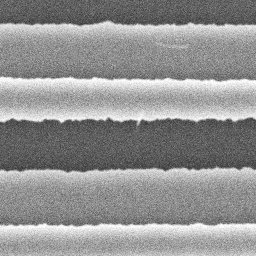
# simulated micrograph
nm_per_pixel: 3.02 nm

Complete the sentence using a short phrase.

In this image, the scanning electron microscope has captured lines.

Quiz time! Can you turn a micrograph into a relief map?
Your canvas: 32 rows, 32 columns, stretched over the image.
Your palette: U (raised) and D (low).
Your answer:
DDDDDDDDDDDDDDDDDDDDDDDDDDDDDDDD
DDDDDDDDDDDDDDDDDDDDDDDDDDDDDDDD
DDDDDDDDDDDDDDDDDDDDDDDDDDDDDDDD
UUUUUUUUUUUUUUUUUUUUUUUUUUUUUUUU
UUUUUUUUUUUUUUUUUUUUUUUUUUUUUUUU
UUUUUUUUUUUUUUUUUUUUUUUUUUUUUUUU
UUUUUUUUUUUUUUUUUUUUUUUUUUUUUUUU
UUUUUUUUUUUUUUUUUUUUUUUUUUUUUUUU
UUUUUUUUUUUUUUUUUUUUUUUUUUUUUUUU
UUUUUUUUUUUUUUUUUUUUUUUUUUUUUUUU
UUUUUUUUUUUUUUUUUUUUUUUUUUUUUUUU
UUUUUUUUUUUUUUUUUUUUUUUUUUUUUUUU
UUUUUUUUUUUUUUUUUUUUUUUUUUUUUUUU
UUUUUUUUUUUUUUUUUUUUUUUUUUUUUUUU
UUUUUUUUUUUUUUUUUUUUUUUUUUUUUUUU
DDDDDDDDDDDDDDDDDDDDDDDDDDDDDDDD
DDDDDDDDDDDDDDDDDDDDDDDDDDDDDDDD
DDDDDDDDDDDDDDDDDDDDDDDDDDDDDDDD
DDDDDDDDDDDDDDDDDDDDDDDDDDDDDDDD
DDDDDDDDDDDDDDDDDDDDDDDDDDDDDDDD
DDDDDDDDDDDDDDDDDDDDDDDDDDDDDDDD
UUUUUUUUDDDUUUUUUUUUUUUUUUUUUUUU
UUUUUUUUUUUUUUUUUUUUUUUUUUUUUUUU
UUUUUUUUUUUUUUUUUUUUUUUUUUUUUUUU
UUUUUUUUUUUUUUUUUUUUUUUUUUUUUUUU
UUUUUUUUUUUUUUUUUUUUUUUUUUUUUUUU
UUUUUUUUUUUUUUUUUUUUUUUUUUUUUUUU
UUUUUUUUUUUUUUUUUUUUUUUUUUUUUUUU
UUUUUUUUUUUUUUUUUUUUUUUUUUUUUUUU
UUUUUUUUUUUUUUUUUUUUUUUUUUUUUUUU
UUUUUUUUUUUUUUUUUUUUUUUUUUUUUUUU
UUUUUUUUUUUUUUUUUUUUUUUUUUUUUUUU